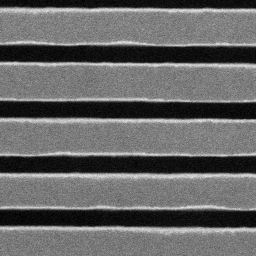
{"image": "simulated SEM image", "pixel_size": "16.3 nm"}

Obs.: lines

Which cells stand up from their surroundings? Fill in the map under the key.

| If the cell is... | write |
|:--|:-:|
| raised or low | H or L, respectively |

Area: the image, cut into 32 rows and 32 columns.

LLLLLLLLLLLLLLLLLLLLLLLLLLLLLLLL
HHHHHHHHHHHHHHHHHHHHHHHHHHHHHHHH
HHHHHHHHHHHHHHHHHHHHHHHHHHHHHHHH
HHHHHHHHHHHHHHHHHHHHHHHHHHHHHHHH
HHHHHHHHHHHHHHHHHHHHHHHHHHHHHHHH
HHHHHHHHHHHHHHHHHHHHHHHHHHHHHHHH
LLLLLLLLLLLLLLLLLLLLLLLLLLLLLLLL
LLLLLLLLLLLLLLLLLLLLLLLLLLLLLLLL
HHHHHHHHHHHHHHHHHHHHHHHHHHHHHHHH
HHHHHHHHHHHHHHHHHHHHHHHHHHHHHHHH
HHHHHHHHHHHHHHHHHHHHHHHHHHHHHHHH
HHHHHHHHHHHHHHHHHHHHHHHHHHHHHHHH
HHHHHHHHHHHHHHHHHHHHHHHHHHHHHHHH
LLLLLLLLLLLLLLLLLLLLLLLLLLLLLLLL
LLLLLLLLLLLLLLLLLLLLLLLLLLLLLLLL
HHHHHHHHHHHHHHHHHHHHHHHHHHHHHHHH
HHHHHHHHHHHHHHHHHHHHHHHHHHHHHHHH
HHHHHHHHHHHHHHHHHHHHHHHHHHHHHHHH
HHHHHHHHHHHHHHHHHHHHHHHHHHHHHHHH
LLLLLLLLLLLLLLLLLLLLLLLLLLLLLLLL
LLLLLLLLLLLLLLLLLLLLLLLLLLLLLLLL
LLLLLLLLLLLLLLLLLLLLLLLLLLLLLLLL
HHHHHHHHHHHHHHHHHHHHHHHHHHHHHHHH
HHHHHHHHHHHHHHHHHHHHHHHHHHHHHHHH
HHHHHHHHHHHHHHHHHHHHHHHHHHHHHHHH
HHHHHHHHHHHHHHHHHHHHHHHHHHHHHHHH
LLLLLLLLLLLLLLLLLLLLLLLLLLLLLLLL
LLLLLLLLLLLLLLLLLLLLLLLLLLLLLLLL
HHHHHHHHHHHHHHHHHHHHHHHHHHLLLLHL
HHHHHHHHHHHHHHHHHHHHHHHHHHHHHHHH
HHHHHHHHHHHHHHHHHHHHHHHHHHHHHHHH
HHHHHHHHHHHHHHHHHHHHHHHHHHHHHHHH